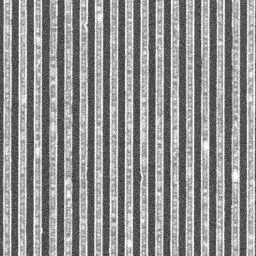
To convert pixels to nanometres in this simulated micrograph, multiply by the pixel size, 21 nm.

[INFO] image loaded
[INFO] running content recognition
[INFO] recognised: parallel lines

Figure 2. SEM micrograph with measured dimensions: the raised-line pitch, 0.32 micrometres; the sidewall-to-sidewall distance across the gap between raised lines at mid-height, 173 nm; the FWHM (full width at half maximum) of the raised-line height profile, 152 nm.